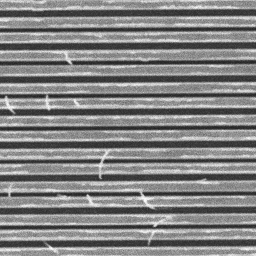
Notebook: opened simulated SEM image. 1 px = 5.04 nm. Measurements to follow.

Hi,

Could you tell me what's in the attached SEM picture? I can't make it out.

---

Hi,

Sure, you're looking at parallel lines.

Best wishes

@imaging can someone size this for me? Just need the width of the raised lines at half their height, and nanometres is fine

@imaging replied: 50.4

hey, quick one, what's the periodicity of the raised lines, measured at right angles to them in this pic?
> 0.0823 micrometres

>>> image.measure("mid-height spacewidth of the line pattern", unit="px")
7.26